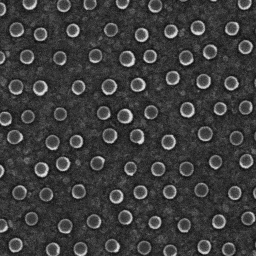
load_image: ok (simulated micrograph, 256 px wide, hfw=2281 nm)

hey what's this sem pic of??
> a regular array of raised bodies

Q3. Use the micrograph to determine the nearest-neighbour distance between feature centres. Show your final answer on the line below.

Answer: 230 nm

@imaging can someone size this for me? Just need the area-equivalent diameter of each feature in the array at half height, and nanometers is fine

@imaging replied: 122